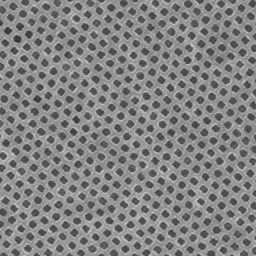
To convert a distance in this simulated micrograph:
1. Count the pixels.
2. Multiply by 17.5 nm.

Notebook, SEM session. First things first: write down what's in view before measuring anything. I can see a regular array of holes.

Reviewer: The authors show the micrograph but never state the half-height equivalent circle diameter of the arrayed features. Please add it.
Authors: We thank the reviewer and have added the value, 148 nm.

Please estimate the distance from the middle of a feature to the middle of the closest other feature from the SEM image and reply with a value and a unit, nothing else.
0.209 µm